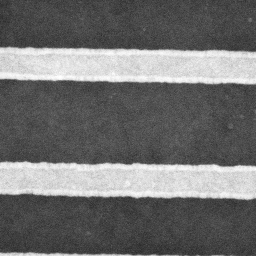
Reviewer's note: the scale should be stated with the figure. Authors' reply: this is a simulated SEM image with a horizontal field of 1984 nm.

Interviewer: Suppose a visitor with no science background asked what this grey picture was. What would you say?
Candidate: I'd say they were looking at lines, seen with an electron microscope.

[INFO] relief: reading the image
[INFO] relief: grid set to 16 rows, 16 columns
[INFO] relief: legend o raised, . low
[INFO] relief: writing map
................
................
................
oooooooooooooooo
oooooooooooooooo
................
................
................
................
................
oooooooooooooo.o
oooooooooooooooo
................
................
................
................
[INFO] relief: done